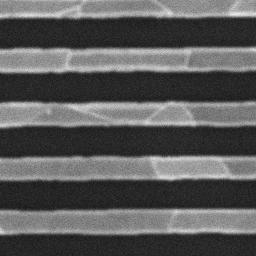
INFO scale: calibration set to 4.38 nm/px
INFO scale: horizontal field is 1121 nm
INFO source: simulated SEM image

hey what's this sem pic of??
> lines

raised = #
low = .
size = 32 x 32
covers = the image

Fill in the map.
################################
################################
................................
................................
................................
................................
################################
################################
################################
................................
................................
................................
................................
################################
################################
################################
................................
................................
................................
................................
################################
################################
................................
................................
................................
................................
#.......########################
################################
################################
................................
................................
................................